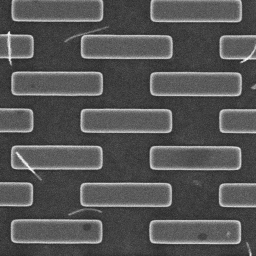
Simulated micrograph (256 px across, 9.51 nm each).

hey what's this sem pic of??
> groups of lines, slits or small figures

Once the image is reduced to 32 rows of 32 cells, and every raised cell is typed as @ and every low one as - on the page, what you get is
-@@@@@@@@@@@@------@@@@@@@@@@@--
-@@@@@@@@@@@@------@@@@@@@@@@@--
--@@@@@@@@@@-------@@@@@@@@@@@--
--------------------------------
@@@@-------@@@@--@--------------
@@@@------@@@@@@@@@@@@------@@@@
@@@@------@@@@@@@@@@@@------@@@@
--------------------------------
--------------------------------
-@@@@@@@@@@@@------@@@@@@@@@@@--
-@@@@@@@@@@@@------@@@@@@@@@@@--
--@@@@@@@@@@@------@@@@@@@@@@@--
--------------------------------
--------------------------------
@@@@------@@@@@@@@@@@------@@@@@
@@@@------@@@@@@@@@@@-------@@@@
------------------@@@-------@@@@
--------------------------------
--@@@@@@@@@@-------@@@@@@@@@@@--
-@@@@@@@@@@@@------@@@@@@@@@@@--
-@@@@@@@@@@@@------@@@@@@@@@@@--
--------------------------------
--------------------------------
@@@@------@@@@@@@@@@@------@@@@@
@@@@------@@@@@@@@@@@------@@@@@
@@@@------@@@@@@@@@@@-------@@@@
--------------------------------
--------------------------------
-@@@@@@@@@@@@------@@@@@@@@@@@--
-@@@@@@@@@@@@------@@@@@@@@@@@--
--------------------------------
--------------------------------